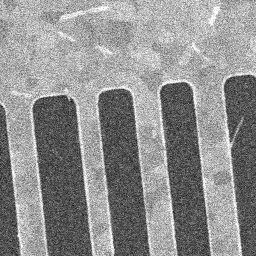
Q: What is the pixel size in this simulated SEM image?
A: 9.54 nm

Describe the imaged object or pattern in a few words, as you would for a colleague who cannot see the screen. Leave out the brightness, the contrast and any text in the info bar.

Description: one or a few lines or trenches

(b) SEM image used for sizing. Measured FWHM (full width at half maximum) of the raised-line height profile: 25.2 px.